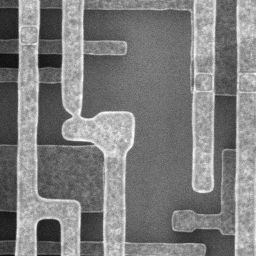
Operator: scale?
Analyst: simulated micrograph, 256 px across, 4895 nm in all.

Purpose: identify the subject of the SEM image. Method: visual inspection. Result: wiring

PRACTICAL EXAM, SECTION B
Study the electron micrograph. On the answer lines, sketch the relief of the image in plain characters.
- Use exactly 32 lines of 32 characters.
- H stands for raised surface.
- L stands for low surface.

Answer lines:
LLHHHLLLHHLLLLLLLLLLLLLLHHHLLLHH
LLHHHLLLHHLLLLLLLLLLLLLLHHHLLLHH
LLHHHLLLHHLLLLLLLLLLLLLLHHHLLLHH
LLHHHLLLHHLLLLLLLLLLLLLLHHHLLLHH
LLHHHLLLHHLLLLLLLLLLLLLLHHHLLLHH
LLHHHLLLHHLLLLLLLLLLLLLLHHHLLLHH
LLHHHLLLHHLLLLLLLLLLLLLLHHHLLLHH
LLHHHLLLHHLLLLLLLLLLLLLLHHHLLLHH
LLHHHLLLHHLLLLLLLLLLLLLLHHHLLLHH
LLHHHLLLHHLLLLLLLLLLLLLLHHHLLLHH
LLHHHLLLHHLLLLLLLLLLLLLLHHHLLLHH
LLHHHLLLHHLLLLLLLLLLLLLLHHHLLLHH
LLHHHLLLHHLLLLLLLLLLLLLLHHHLLLHH
LLHHHLLLHHLLLLLLLLLLLLLLHHHLLLHH
LLHHHLLLLHLLHHHHHLLLLLLLHHHLLLHH
LLHHHLLLHHHHHHHHHLLLLLLLHHHLLLHH
LLHHHLLLHHHHHHHHHLLLLLLLHHHLLLHH
LLHHLLLLLHHHHHHHHLLLLLLLHHHLLLHH
LLHHHLLLLLLLHHHHLLLLLLLLHHHLLLHH
LLHHHLLLLLLLLHHHLLLLLLLLHHHLLLHH
LLHHHLLLLLLLLHHHLLLLLLLLHHHLLLHH
LLHHHLLLLLLLLHHHLLLLLLLLHHHLLLHH
LLHHHLLLLLLLLHHHLLLLLLLLHHHLLHHH
LLHHHLLLLLLLLHHHLLLLLLLLHHHLLHHH
LLHHHLLLLLLLLHHHLLLLLLLLLLLLLHHH
LLHHHHHHHHLLLHHHLLLLLLLLLLLLLHHH
LLHHHHHHHHLLLHHHLLLLLLLLLLLLLHHH
LLHHHLLHHHLLLHHHLLLLLLLLLLLLLHHH
LLHHHLLLHHLLLHHHLLLLLLLLLLLLLHHH
LLHHLLLLHHLLLHHHLLLLLLLLLLLLLHHH
LLHHLLLLHHLLLHHHLLLLLLLLLLLLLHHH
LLHHHLLLHHLLLHHHLLLLLLLLLLLLLHHH